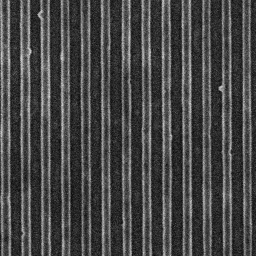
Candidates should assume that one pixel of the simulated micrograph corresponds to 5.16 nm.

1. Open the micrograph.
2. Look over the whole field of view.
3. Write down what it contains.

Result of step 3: parallel lines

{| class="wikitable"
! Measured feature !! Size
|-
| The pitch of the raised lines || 0.104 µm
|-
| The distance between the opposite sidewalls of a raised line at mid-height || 39.3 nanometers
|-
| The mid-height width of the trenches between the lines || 0.0632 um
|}